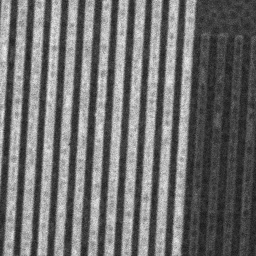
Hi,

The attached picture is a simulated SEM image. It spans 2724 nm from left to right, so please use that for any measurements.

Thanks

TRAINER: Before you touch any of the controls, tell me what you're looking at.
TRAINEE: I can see parallel lines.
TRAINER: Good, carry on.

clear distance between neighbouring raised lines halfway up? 98.2 nanometres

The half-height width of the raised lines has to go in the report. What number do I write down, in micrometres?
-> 0.0809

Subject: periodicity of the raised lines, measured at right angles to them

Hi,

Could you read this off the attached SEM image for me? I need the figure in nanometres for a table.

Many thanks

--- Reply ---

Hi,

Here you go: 178